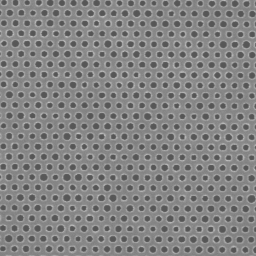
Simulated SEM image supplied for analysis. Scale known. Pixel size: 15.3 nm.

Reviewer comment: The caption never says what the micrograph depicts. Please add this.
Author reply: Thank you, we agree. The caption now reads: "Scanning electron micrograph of a regular array of holes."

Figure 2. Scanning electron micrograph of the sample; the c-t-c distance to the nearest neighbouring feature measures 11.2 pixels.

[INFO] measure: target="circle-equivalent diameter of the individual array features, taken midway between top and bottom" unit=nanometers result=92.8